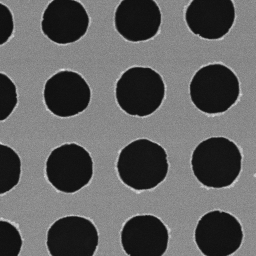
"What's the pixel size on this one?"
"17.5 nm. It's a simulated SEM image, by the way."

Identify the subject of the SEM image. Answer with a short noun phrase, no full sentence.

holes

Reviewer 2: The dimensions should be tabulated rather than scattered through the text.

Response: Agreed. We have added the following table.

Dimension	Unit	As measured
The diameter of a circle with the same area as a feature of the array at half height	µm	0.859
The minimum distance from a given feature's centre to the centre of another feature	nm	1280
